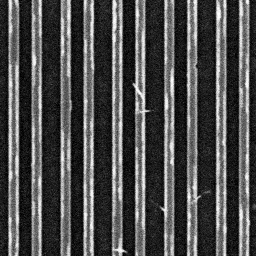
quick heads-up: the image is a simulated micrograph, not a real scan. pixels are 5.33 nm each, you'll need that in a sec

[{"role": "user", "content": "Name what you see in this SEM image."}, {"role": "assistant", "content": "parallel lines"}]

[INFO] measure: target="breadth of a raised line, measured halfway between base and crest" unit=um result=0.05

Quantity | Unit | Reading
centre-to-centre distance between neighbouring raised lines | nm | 136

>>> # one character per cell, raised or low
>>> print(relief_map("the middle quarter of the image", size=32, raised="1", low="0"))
11000110000011000011000001100001
11000110000011000011000001100001
11000110000011000011000001100001
11000110000011000011000001100001
11000110000011000011000001100001
11000110000011000011000001100001
11000110000011000011000001100001
11000110000011000011000001100001
11000110000011000011000001100001
11000110000011000011000001100001
11000110000011000011000001100001
11000110000011000011000001100001
11000110000011000011000001100001
11000110000011000011000001100001
11000110000011000011000001100001
11000110000011000011000001100001
11000110000011000011000001100001
11000110000011000011000001100001
11000110000011000011000001100001
11000110000011000011000001100001
11000110000011000011000001100001
11000110000011000011000001100001
11000110000011000011000001100001
11000110000011000011000001100001
11000110000011000011000001100001
11000110000011000011000001100001
11000110000011000011000001100001
11000110000011000011000001100001
11000110000011000011000001100001
11000110000011000011000001100001
11000110000011000011000001100001
11000110000011000011000001100001